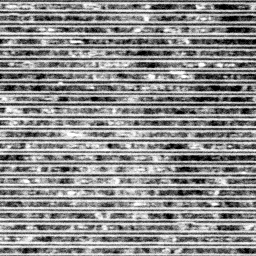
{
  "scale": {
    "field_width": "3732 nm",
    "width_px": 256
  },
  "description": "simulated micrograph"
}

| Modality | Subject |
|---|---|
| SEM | parallel lines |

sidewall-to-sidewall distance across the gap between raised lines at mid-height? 0.109 micrometres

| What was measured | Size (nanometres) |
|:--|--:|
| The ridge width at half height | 54.7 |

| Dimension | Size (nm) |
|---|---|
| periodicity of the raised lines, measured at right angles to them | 170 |